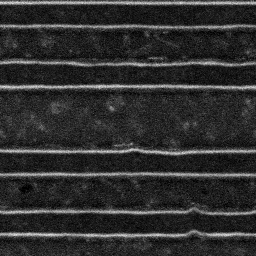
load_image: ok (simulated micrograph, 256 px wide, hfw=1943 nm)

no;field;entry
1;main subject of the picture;one or a few lines or trenches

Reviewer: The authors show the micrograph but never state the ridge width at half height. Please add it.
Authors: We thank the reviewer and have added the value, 178 nm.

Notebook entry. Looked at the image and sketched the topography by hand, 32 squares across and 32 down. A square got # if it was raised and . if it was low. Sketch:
################################
################################
################################
................................
................................
................................
................................
................................
################################
################################
################################
................................
................................
................................
................................
................................
................................
................................
................................
################################
################################
################################
................................
................................
................................
................................
..######...............##.......
################################
################################
................................
................................
................................